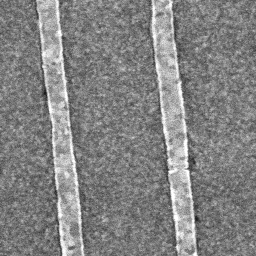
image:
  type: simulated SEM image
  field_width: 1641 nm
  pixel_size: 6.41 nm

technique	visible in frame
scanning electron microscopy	one or a few lines or trenches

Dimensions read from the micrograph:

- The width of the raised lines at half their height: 124 nm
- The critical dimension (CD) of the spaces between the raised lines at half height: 604 nanometers